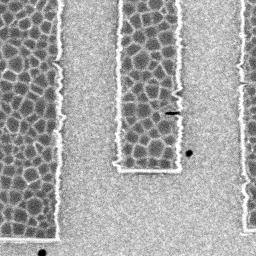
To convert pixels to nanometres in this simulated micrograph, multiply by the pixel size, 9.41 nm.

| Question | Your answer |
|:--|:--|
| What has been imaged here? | one or a few lines or trenches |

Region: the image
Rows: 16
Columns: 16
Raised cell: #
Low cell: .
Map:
####....###....#
####....###....#
####...####....#
####...####....#
####...####....#
####...####....#
####...####....#
####...####....#
####...####....#
####...####....#
####....###....#
####...........#
####...........#
####...........#
####............
................